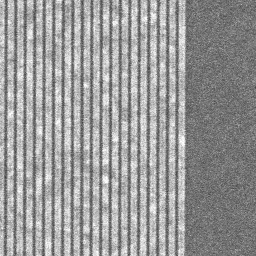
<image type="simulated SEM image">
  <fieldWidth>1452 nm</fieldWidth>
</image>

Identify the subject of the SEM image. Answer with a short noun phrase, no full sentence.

parallel lines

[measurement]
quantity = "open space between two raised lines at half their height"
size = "25.5 nm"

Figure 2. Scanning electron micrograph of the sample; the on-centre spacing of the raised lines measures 53.9 nm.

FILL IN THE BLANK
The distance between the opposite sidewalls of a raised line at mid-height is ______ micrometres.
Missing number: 0.0291